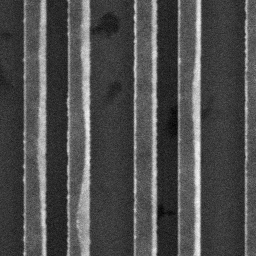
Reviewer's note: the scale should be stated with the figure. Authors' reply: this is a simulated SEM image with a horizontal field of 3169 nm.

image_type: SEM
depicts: lines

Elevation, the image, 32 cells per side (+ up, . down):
...++....++......++...+++......+
...++....++......++...+++......+
...++...+++......++...+++......+
...++....++......++...+++......+
...++...+++......++...+++......+
...++....++......++...+++......+
...++....++......++...+++......+
...++....++......++...+++......+
...++....++......++...+++......+
...++....++......++...+++......+
...++....++......++...+++......+
...++....++......++...+++......+
...++...+++......++...+++......+
...++...+++......++...+++......+
...++....++......++...+++......+
...++....++......++...+++......+
...++...+++......++...+++......+
...++...+++......++...+++......+
...++...+++......++...+++......+
...++....++......++...+++......+
...++...+++......++...+++......+
...++...+++......++...+++......+
...++...+++......++...+++......+
...++...+++......++...+++......+
...++...+++......++...+++......+
...++...+++......++...+++......+
...++...+++......++...+++......+
...++...+++......++...+++......+
...++...+++......++...+++......+
...+++..+++......++...+++......+
...+++..+++......++...+++......+
...+++..+++......++...+++......+